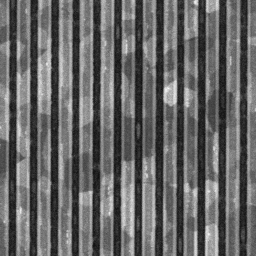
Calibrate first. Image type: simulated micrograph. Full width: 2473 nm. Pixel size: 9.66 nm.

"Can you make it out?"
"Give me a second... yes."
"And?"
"parallel lines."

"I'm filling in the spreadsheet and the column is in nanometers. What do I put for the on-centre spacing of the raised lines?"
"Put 202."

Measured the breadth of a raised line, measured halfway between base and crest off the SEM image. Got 11 px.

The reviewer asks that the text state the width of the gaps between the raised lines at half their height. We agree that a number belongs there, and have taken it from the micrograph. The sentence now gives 0.0966 microns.